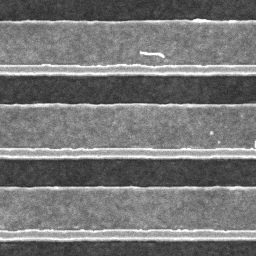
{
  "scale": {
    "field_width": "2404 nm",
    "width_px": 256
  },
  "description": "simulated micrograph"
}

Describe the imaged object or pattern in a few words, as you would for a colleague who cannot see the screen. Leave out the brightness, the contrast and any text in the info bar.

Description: lines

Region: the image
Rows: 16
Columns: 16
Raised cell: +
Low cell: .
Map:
................
++++++++++++++++
++++++++++++++++
++++++++++++++++
++++++++++++++++
................
................
++++++++++++++++
++++++++++++++++
++++++++++++++++
................
................
++++++++++++++++
++++++++++++++++
++++++++++++++++
................